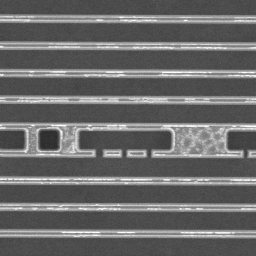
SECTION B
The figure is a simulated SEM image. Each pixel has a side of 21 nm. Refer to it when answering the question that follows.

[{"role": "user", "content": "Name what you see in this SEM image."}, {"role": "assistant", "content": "parallel lines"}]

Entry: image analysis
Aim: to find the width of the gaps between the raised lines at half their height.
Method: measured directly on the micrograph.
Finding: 441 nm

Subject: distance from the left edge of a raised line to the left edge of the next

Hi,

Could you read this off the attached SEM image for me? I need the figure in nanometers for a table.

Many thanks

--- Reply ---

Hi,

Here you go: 564